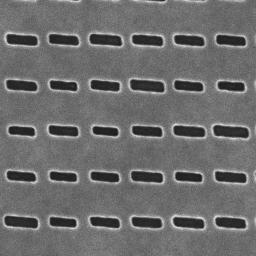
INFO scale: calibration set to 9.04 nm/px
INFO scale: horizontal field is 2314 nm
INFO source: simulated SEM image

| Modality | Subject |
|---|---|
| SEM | a regular array of holes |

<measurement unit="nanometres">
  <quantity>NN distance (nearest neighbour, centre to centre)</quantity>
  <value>377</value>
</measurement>